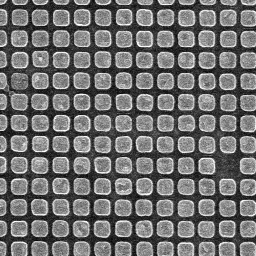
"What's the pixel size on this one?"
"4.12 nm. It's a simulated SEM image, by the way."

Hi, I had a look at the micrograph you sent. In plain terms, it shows a regular array of raised bodies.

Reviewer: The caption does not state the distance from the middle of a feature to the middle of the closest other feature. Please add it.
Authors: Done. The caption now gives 20.6 pixels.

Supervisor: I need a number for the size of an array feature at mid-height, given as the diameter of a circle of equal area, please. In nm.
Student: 71.5